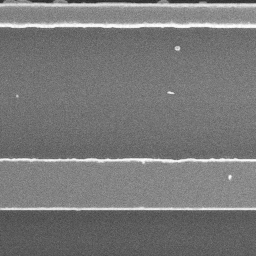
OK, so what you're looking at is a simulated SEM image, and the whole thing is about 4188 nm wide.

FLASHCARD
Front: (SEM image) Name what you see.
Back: lines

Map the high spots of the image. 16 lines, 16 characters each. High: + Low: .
++++++++++++++++
++++++++++++++++
................
................
................
................
................
................
................
................
++++++++++++++++
++++++++++++++++
++++++++++++++++
................
................
................